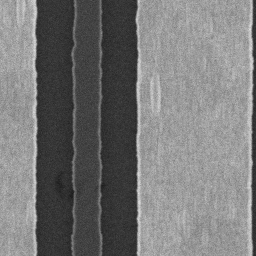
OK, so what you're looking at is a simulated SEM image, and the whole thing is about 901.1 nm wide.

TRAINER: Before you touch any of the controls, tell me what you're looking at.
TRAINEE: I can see lines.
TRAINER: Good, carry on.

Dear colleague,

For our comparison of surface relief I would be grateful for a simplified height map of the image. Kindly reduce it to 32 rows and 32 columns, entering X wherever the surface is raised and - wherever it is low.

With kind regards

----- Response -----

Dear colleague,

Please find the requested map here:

XXXX-----XXXX----XXXXXXXXXXXXXXX
XXXXX----XXXX----XXXXXXXXXXXXXXX
XXXX-----XXXX----XXXXXXXXXXXXXXX
XXXX-----XXXX----XXXXXXXXXXXXXX-
XXXX-----XXXX----XXXXXXXXXXXXXX-
XXXX-----XXXX----XXXXXXXXXXXXXXX
XXXX-----XXXX----XXXXXXXXXXXXXXX
XXXX-----XXXX----XXXXXXXXXXXXXXX
XXXX-----XXXX----XXXXXXXXXXXXXXX
XXXX-----XXXX----XXXXXXXXXXXXXXX
XXXX-----XXXX----XXXXXXXXXXXXXXX
XXXXX----XXXX----XXXXXXXXXXXXXXX
XXXXX----XXXX----XXXXXXXXXXXXXXX
XXXX-----XXXX----XXXXXXXXXXXXXX-
XXXX-----XXXX----XXXXXXXXXXXXXX-
XXXXX----XXXX----XXXXXXXXXXXXXX-
XXXXX----XXXX----XXXXXXXXXXXXXX-
XXXX-----XXXX----XXXXXXXXXXXXXX-
XXXXX----XXXX----XXXXXXXXXXXXXX-
XXXXX----XXXX----XXXXXXXXXXXXXX-
XXXX-----XXXX----XXXXXXXXXXXXXX-
XXXX-----XXXX----XXXXXXXXXXXXXX-
XXXX-----XXXX----XXXXXXXXXXXXXX-
XXXX-----XXXX----XXXXXXXXXXXXXX-
XXXX-----XXXX----XXXXXXXXXXXXXX-
XXXX-----XXXX----XXXXXXXXXXXXXX-
XXXX-----XXXX----XXXXXXXXXXXXXX-
XXXXX----XXXX----XXXXXXXXXXXXXX-
XXXX-----XXXX----XXXXXXXXXXXXXX-
XXXX-----XXXX----XXXXXXXXXXXXXX-
XXXX-----XXXX----XXXXXXXXXXXXXX-
XXXXX----XXXX----XXXXXXXXXXXXXX-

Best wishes